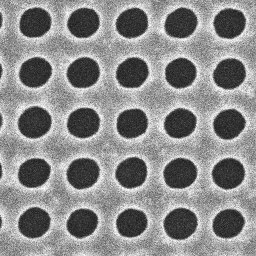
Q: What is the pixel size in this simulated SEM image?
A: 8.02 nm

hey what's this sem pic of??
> a regular array of holes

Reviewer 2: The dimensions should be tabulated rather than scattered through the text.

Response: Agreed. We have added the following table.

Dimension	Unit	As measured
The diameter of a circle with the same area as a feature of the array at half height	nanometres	256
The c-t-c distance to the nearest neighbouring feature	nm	388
